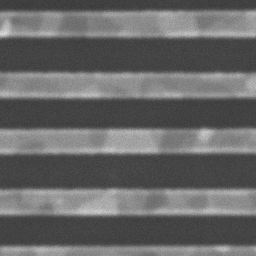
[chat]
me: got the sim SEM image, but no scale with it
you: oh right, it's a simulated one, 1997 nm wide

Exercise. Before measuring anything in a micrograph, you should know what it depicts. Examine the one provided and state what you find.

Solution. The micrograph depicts lines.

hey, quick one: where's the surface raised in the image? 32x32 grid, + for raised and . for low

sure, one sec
................................
..................+...+.++++++++
++++++++++++++++++++++++++++++++
++++++++++++++++++++++++++++++++
................................
................................
................................
................................
................................
++++++++++++++++++++++++++++++++
++++++++++++++++++++++++++++++++
++++++++++++++++++++++++++++++++
................................
................................
................................
................................
++++++++++++++++++++++++++++++++
++++++++++++++++++++++++++++++++
++++++++++++++++++++++++++++++++
................................
................................
................................
................................
................................
++++++++++++++++++++++++++++++++
++++++++++++++++++++++++++++++++
++++++++++++++++++++++++++++++++
................................
................................
................................
................................
++++++++++++++++++++++++++++++++